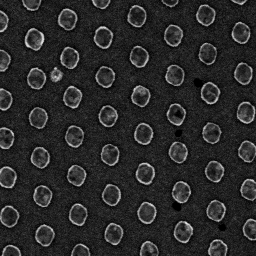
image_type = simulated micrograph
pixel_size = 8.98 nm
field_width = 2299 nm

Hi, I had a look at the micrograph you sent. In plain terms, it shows a regular array of raised bodies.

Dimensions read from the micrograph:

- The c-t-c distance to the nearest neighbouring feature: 0.348 micrometres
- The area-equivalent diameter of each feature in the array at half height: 0.171 micrometres